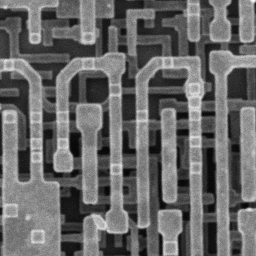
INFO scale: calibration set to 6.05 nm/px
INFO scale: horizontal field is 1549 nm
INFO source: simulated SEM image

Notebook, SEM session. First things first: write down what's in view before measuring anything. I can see wiring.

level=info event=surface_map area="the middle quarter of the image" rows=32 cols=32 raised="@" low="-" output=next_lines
-@@@@@@@@@@@@@@-----@@@@@@@@@@@@
@@@@@----@@@@@@----@@@@--------@
@@@--------@@@@---@@@@---------@
@@---------@@@----@@@@---------@
@----------@@@----@@@----------@
@----------@@@----@@@---------@@
@-----------@@----@@@---------@@
@-----------@@----@@@----------@
@----------@@@----@@@----------@
@@--------@@@@----@@@----------@
@@@@@@@@@@@@@@----@@@----------@
@@@@@@@@@@@@@@----@@@----@@@---@
@--@@@@@@---@@----@@@---@@@@---@
@--@@@@@@---@@----@@@---@@@@---@
@@@@@@@@@---@@@@@@@@@@@@@@@@@@@@
@@@@@@@@@---@@@@@@@@@@@@@@@@@@@@
@@@@@@@@@---@@@-@@@@@---@@@@---@
@----@@@@---@@--@@@@@---@@@@---@
@----@@@@---@@--@@@@@---@@@@---@
@----@@@@---@@--@@@@@---@@@@--@@
@----@@@@---@@--@@@@@----@@@--@@
@----@@@@---@@----@@@---@@@@--@@
@@---@@@----@@----@@@---@@@@--@@
@@@@@@@@@@@@@@@@@@@@@@@--@@@--@@
@@@@@@@@@@@@@@@@@@@@@@@--@@@--@@
@@@@@@@@@@@@@@@@@@@@@@@--@@@--@@
@@---@@@@---@@@---@@@@@--@@@---@
-----@@@----@@@---@@@@@--@@@---@
--@@@@@@@@@@@@@@@@@@@@@--@@@---@
@@@@@@@@@@@@@@@@@@@@@@@--@@@----
--@@@@@@@--@@@@-@@@@@@@--@@@----
-----@@@----@@@-@@@@@@@--@@@----